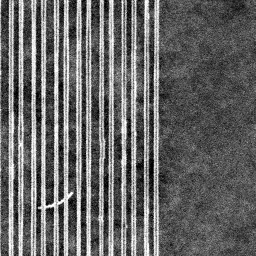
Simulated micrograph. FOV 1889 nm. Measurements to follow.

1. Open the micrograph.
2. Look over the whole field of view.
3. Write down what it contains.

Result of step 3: parallel lines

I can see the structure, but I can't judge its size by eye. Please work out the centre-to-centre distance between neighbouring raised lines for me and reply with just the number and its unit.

82.2 nanometres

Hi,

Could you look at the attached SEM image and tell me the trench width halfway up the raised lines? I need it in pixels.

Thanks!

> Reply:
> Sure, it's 6.99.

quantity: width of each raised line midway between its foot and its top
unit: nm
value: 22.1